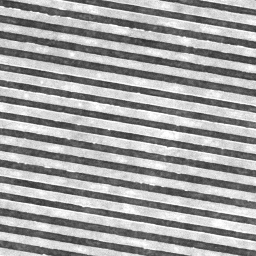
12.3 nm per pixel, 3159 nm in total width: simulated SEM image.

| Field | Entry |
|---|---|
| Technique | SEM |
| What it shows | parallel lines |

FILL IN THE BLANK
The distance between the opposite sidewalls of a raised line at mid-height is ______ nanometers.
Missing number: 97.3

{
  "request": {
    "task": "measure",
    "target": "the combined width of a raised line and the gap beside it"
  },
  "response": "196 nm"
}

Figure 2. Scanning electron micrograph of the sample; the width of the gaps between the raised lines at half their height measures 97.3 nanometers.